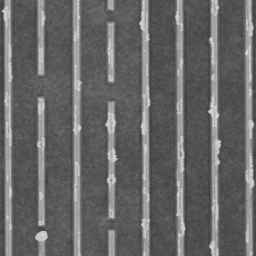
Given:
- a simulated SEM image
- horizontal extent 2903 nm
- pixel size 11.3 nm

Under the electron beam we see parallel lines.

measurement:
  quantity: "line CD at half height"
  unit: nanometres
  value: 72.3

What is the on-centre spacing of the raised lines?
390 nm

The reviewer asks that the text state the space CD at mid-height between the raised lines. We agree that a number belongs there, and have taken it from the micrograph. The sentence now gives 27.5 pixels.